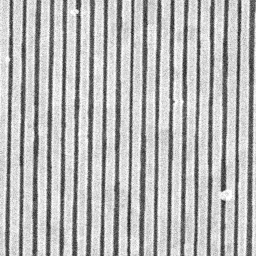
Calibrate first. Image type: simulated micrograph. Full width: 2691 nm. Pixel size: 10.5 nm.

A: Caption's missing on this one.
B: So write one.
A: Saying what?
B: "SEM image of parallel lines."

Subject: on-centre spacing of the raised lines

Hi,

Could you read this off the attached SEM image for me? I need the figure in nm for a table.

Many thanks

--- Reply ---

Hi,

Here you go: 141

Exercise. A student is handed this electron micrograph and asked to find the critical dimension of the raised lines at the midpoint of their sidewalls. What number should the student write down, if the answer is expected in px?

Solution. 7.25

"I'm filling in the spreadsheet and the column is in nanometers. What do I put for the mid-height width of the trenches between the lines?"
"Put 65.7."